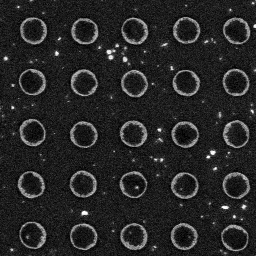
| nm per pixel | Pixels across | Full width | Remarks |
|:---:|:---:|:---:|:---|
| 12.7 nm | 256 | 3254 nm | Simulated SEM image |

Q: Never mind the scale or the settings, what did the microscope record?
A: a regular array of raised bodies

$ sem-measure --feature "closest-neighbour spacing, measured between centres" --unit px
50.2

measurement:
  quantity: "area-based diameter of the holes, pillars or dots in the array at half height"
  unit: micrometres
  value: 0.329